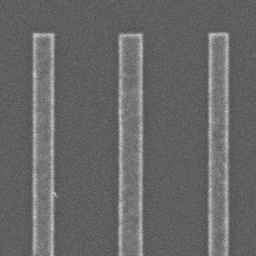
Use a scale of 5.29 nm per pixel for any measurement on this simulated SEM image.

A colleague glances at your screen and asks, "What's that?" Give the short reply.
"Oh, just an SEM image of one or a few lines or trenches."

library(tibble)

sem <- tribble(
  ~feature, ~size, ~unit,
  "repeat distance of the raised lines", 464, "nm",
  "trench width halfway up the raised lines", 361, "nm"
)